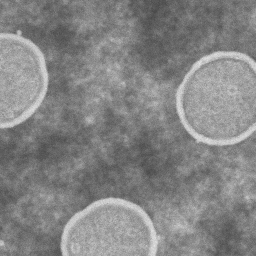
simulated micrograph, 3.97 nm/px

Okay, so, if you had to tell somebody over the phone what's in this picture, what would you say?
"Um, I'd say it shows raised bodies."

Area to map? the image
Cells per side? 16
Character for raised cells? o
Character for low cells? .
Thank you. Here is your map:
................
................
o...............
ooo..........oo.
ooo.........oooo
ooo........ooooo
oo.........ooooo
o..........ooooo
............ooo.
................
................
................
................
.....oooo.......
....oooooo......
....oooooo......